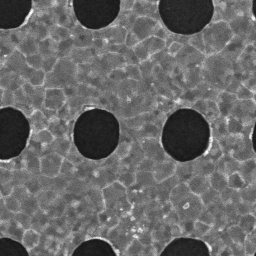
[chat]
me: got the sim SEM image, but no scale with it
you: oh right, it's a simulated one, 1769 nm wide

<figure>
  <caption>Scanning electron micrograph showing holes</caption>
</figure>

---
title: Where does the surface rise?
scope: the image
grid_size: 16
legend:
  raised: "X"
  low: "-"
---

--XXX--XXX---XXX
-XXXX--XXX---XXX
XXXXXXXXXXXXXXXX
XXXXXXXXXXXXXXXX
XXXXXXXXXXXXXXXX
XXXXXXXXXXXXXXXX
XXXXXXXXXXXXXXXX
--XXX--XXX---XXX
--XXX--XXX---XXX
-XXXX--XXX---XXX
XXXXXXXXXXXXXXXX
XXXXXXXXXXXXXXXX
XXXXXXXXXXXXXXXX
XXXXXXXXXXXXXXXX
XXXXXXXXXXXXXXXX
-XXXX--XXX---XXX